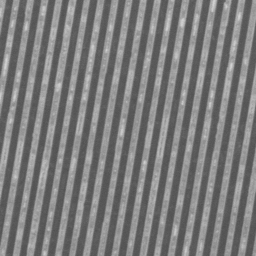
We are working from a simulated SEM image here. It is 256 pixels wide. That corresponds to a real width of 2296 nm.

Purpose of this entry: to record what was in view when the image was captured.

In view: parallel lines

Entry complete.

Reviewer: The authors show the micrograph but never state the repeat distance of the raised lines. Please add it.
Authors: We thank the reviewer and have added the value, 125 nm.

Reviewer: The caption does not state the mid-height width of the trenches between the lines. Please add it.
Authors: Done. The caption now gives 67.5 nm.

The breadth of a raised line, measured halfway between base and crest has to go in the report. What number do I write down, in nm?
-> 53.1